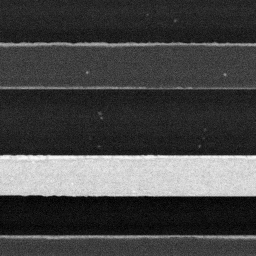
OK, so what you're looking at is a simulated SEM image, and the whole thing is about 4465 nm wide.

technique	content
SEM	lines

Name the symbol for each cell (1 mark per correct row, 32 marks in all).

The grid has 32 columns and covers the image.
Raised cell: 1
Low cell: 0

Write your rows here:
00000000000000000000000000000000
00000000000000000000000000000000
00000000000000000000000000000000
00000000000000000000000000000000
00000000000000000000000000000000
00001111110100000000000000000000
11111111111111111111111111111111
11111111111111111111111111111111
11111111111111111111111111111111
11111111111111111111111111111111
11111111111111111111111111111111
00000000000000000000000000000000
00000000000000000000000000000000
00000000000000000000000000000000
00000000000000000000000000000000
00000000000000000000000000000000
00000000000000000000000000000000
00000000000000000000000000000000
00000000000000000000000000000000
00000000000000000000000000000000
11111111111111111111111111111111
11111111111111111111111111111111
11111111111111111111111111111111
11111111111111111111111111111111
00000000000000000000000000000000
00000000000000000000000000000000
00000000000000000000000000000000
00000000000000000000000000000000
00000000000000000000000000000000
00000000000000000000000000000000
11111111111111111111111111111111
11111111111111111111111111111111